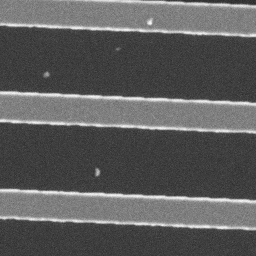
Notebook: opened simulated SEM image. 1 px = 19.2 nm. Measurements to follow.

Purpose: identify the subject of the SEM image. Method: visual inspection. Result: lines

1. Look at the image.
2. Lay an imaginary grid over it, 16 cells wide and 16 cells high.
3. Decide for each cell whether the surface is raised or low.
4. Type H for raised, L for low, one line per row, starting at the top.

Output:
HHHHHHHHHHHHHHHH
HHHHHHHHHHHHHHHH
LLLLLLLLLLLLLLLL
LLLLLLLLLLLLLLLL
LLLLLLLLLLLLLLLL
LLLLLLLLLLLLLLLL
HHHHHHHHHHHHHHHH
HHHHHHHHHHHHHHHH
LLLLLLLLLLLLLLLL
LLLLLLLLLLLLLLLL
LLLLLLLLLLLLLLLL
LLLLLLLLLLLLLLLL
HHHHHHHHHHHHHHHL
HHHHHHHHHHHHHHHH
LLLLLLLLLLLLLLLL
LLLLLLLLLLLLLLLL